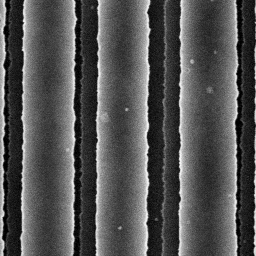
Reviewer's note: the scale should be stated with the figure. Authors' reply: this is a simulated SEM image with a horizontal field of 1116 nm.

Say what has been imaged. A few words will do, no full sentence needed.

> lines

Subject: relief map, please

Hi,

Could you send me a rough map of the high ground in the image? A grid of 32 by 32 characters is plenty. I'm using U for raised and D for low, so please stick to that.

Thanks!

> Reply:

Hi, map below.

UDDUUUUUUDDDUUUUUUUDDDDUUUUUUDDD
UDDUUUUUUDDDUUUUUUDDDDDUUUUUUUDD
UDDUUUUUUDDDUUUUUUUDDDDUUUUUUUDD
DDDUUUUUUDDDUUUUUUUDDDDUUUUUUUDD
DDDUUUUUUDDDUUUUUUUDDDUUUUUUUUDD
UDDUUUUUUDDDUUUUUUUDDDDUUUUUUUDD
UDDUUUUUUDDDUUUUUUDDDDDUUUUUUUDD
UDDUUUUUUDDDUUUUUUDDDDDUUUUUUUDD
DDDUUUUUUDDDUUUUUUUDDDDUUUUUUUDD
UDDUUUUUUDDDUUUUUUUDDDDUUUUUUUDD
DDDUUUUUUDDDUUUUUUDDDDUUUUUUUUDD
DDDUUUUUUDDDUUUUUUUDDDDUUUUUUUDD
DDDUUUUUUDDDUUUUUUDDDDUUUUUUUUDD
DDDUUUUUUDDDUUUUUUDDDDUUUUUUUUDD
DDDUUUUUUDDDUUUUUUDDDDDUUUUUUUDD
UDDUUUUUUDDDUUUUUUUDDDUUUUUUUDDD
DDDUUUUUUDDDUUUUUUDDDDUUUUUUUDDD
DDDUUUUUUDDDUUUUUUDDDDDUUUUUUDDD
DDDUUUUUUDDDUUUUUUUDDDDUUUUUUUDD
DDDUUUUUUDDDUUUUUUDDDDUUUUUUUUDD
DDDUUUUUUDDDUUUUUUDDDDUUUUUUUUDD
DDDUUUUUUDDDUUUUUUDDDDUUUUUUUUDD
DDDUUUUUUDDDUUUUUUUDDDUUUUUUUUDD
DDDUUUUUUDDDUUUUUUDDDDDUUUUUUUDD
DDDUUUUUUDDDUUUUUUDDDDDUUUUUUDDD
DDDUUUUUUDDDUUUUUUDDDDUUUUUUUUDD
DDDUUUUUUDDDUUUUUUDDDDUUUUUUUDDD
DDDUUUUUUDDDUUUUUUDDDDUUUUUUUDDD
DDDUUUUUUDDDUUUUUUDDDDUUUUUUUDDD
DDDUUUUUUDDDUUUUUUDDDDUUUUUUUUDD
DDDUUUUUUDDDUUUUUUDDDDUUUUUUUUDD
DDDUUUUUUDDDUUUUUUDDDDUUUUUUUUDD